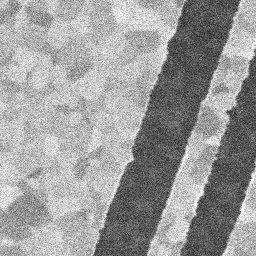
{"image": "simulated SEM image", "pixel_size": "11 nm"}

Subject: one or a few lines or trenches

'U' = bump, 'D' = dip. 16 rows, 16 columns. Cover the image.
UUUUUUUUUUUDDDDU
UUUUUUUUUUUDDDDU
UUUUUUUUUUUDDDUU
UUUUUUUUUUDDDDUU
UUUUUUUUUUDDDUUD
UUUUUUUUUUDDDUUD
UUUUUUUUUDDDDUUD
UUUUUUUUUDDDUUDD
UUUUUUUUDDDDUUDD
UUUUUUUUDDDDUUDD
UUUUUUUUDDDUUDDD
UUUUUUUDDDDUUDDD
UUUUUUUDDDDUDDDU
UUUUUUUDDDUUDDDU
UUUUUUDDDDUUDDDU
UUUUUUDDDUUDDDUU